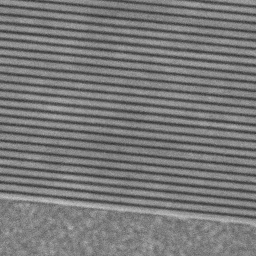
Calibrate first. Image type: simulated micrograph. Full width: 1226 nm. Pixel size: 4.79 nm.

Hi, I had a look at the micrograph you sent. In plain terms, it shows parallel lines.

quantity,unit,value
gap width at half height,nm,13.7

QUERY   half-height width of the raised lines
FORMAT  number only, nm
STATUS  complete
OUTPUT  26.8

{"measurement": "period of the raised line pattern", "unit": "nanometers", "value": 40.2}